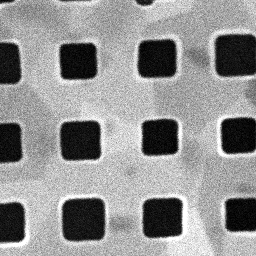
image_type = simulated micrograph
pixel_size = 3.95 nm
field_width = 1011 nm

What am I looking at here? holes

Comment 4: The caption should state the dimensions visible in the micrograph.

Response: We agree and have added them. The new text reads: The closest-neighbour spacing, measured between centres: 312 nm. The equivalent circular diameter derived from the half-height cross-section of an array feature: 43.2 pixels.